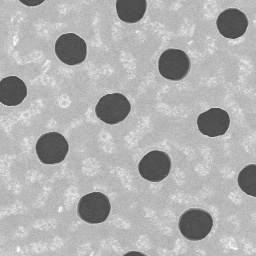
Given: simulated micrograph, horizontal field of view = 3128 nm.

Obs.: a regular array of holes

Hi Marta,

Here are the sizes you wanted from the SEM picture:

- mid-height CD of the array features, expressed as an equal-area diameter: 31.7 pixels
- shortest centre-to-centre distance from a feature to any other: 0.873 microns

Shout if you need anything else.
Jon